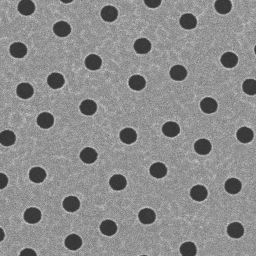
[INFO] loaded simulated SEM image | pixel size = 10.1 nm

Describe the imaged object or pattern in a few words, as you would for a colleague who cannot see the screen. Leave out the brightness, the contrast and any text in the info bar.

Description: a regular array of holes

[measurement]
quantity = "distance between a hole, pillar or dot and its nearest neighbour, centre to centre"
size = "407 nm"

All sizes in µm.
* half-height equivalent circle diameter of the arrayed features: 0.176